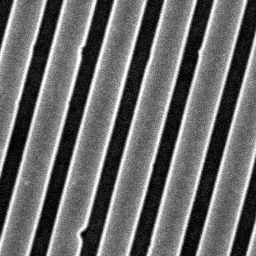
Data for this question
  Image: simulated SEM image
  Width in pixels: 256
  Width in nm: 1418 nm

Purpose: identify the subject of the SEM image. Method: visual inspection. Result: parallel lines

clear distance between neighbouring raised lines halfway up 104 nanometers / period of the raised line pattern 268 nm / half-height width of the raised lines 164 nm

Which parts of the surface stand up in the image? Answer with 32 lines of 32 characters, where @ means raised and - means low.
--@@@@--@@@@--@@@@---@@@---@@@@-
--@@@---@@@---@@@@--@@@@---@@@--
-@@@@--@@@@---@@@@--@@@@--@@@@--
-@@@@--@@@@---@@@---@@@@--@@@@--
-@@@@--@@@@--@@@@---@@@---@@@@--
@@@@---@@@---@@@@--@@@@--@@@@---
@@@@--@@@@---@@@---@@@@--@@@@--@
@@@@--@@@@--@@@@---@@@---@@@@--@
@@@---@@@@--@@@@--@@@@---@@@---@
@@@---@@@---@@@@--@@@@--@@@@---@
@@@--@@@@---@@@---@@@@--@@@@--@@
@@@--@@@@--@@@@---@@@@--@@@@--@@
@@---@@@@--@@@@--@@@@---@@@---@@
@@---@@@---@@@@--@@@@--@@@@---@@
@@--@@@@---@@@---@@@@--@@@@--@@@
@@--@@@@--@@@@---@@@---@@@@--@@@
@---@@@@--@@@@--@@@@---@@@---@@@
@---@@@---@@@@--@@@@--@@@@---@@@
@--@@@@--@@@@---@@@@--@@@@--@@@@
@--@@@@--@@@@--@@@@---@@@@--@@@@
---@@@@--@@@@--@@@@--@@@@---@@@@
--@@@@---@@@---@@@@--@@@@--@@@@-
--@@@@--@@@@---@@@@--@@@@--@@@@-
--@@@@--@@@@--@@@@---@@@---@@@@-
--@@@@--@@@@--@@@@--@@@@---@@@--
-@@@@---@@@---@@@@--@@@@--@@@@--
-@@@@--@@@@---@@@---@@@@--@@@@--
-@@@@--@@@@--@@@@---@@@---@@@@--
-@@@---@@@---@@@@--@@@@---@@@---
@@@@---@@@---@@@@--@@@@--@@@@---
@@@@--@@@@---@@@---@@@@--@@@@--@
@@@@--@@@@--@@@@---@@@---@@@@--@